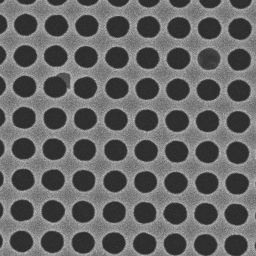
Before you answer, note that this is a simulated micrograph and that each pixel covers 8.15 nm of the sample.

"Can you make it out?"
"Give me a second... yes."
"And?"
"a regular array of holes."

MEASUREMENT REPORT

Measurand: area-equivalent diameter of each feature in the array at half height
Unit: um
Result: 0.184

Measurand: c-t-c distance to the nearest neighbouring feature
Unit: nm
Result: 248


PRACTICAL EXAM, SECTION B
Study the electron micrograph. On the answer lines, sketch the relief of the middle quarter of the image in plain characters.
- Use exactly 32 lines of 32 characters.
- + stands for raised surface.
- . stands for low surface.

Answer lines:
++++...+++++...++++....++++....+
++++++++++++++++++++++++++++++++
++++++++++++++++++++++++++++++++
++++...+++++..++++++++++++++++++
+++.....+++.....++.....+++.....+
.+......++......++......++.....+
.+......++......++......+.......
+++.....+++.....++.....+++.....+
++++...+++++...++++....++++....+
++++++++++++++++++++++++++++++++
++++++++++++++++++++++++++++++++
++++...+++++..++++++.+++++++.+++
+++.....+++....+++.....+++....++
.+......++......++.....++......+
+++.....++......++......+......+
+++....++++.....++.....+++.....+
+++++.++++++..+++++...+++++...++
++++++++++++++++++++++++++++++++
++++++++++++++++++++++++++++++++
+++....++++....++++...+++++...++
++......++......++.....++......+
++......++......+.......+......+
++......++......++.....++......+
+++....++++....+++.....+++.....+
++++++++++++++++++++.++++++...++
++++++++++++++++++++++++++++++++
++++++++++++++++++++++++++++++++
+++....++++....+++....++++....++
++......++......++.....++......+
++......++......++.....++......+
++......++......++.....++......+
+++....++++....+++....++++....++